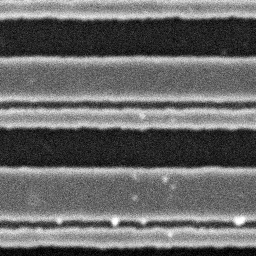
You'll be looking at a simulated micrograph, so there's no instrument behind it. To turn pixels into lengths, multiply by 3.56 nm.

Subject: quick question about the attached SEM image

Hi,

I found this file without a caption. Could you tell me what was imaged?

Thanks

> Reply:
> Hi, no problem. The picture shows lines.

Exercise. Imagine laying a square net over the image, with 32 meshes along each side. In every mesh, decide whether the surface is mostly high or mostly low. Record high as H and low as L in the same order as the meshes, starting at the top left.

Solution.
HHHHHHHHHHHHHHHHHHHHHHHHHHHHHHHH
HHHHHHHHHHHHHHHHHHHHHHHHHHHHHHHH
LLLLLLLLLLLLLLLLLLLLLLLLLLLLLLLL
LLLLLLLLLLLLLLLLLLLLLLLLLLLLLLLL
LLLLLLLLLLLLLLLLLLLLLLLLLLLLLLLL
LLLLLLLLLLLLLLLLLLLLLLLLLLLLLLLL
LLLLLLLLLLLLLLLLLLLLLLLLLLLLLLLL
HHHHHHHHHHHHHHHHHHHHHHHHHHHHHHHH
HHHHHHHHHHHHHHHHHHHHHHHHHHHHHHHH
HHHHHHHHHHHHHHHHHHHHHHHHHHHHHHHH
HHHHHHHHHHHHHHHHHHHHHHHHHHHHHHHH
HHHHHHHHHHHHHHHHHHHHHHHHHHHHHHHH
HHHHHHHHHHHHHHHHHHHHHHHHHHHHHHHH
HHHHHHHHHHHHHHHHHHHHHHHHHHHHHHHH
HHHHHHHHHHHHHHHHHHHHHHHHHHHHHHHH
HHHHHHHHHHHHHHHHHHHHHHHHHHHHHHHH
LLLLLLLLLLLLLLLLLLLLLLLLLLLLLLLL
LLLLLLLLLLLLLLLLLLLLLLLLLLLLLLLL
LLLLLLLLLLLLLLLLLLLLLLLLLLLLLLLL
LLLLLLLLLLLLLLLLLLLLLLLLLLLLLLLL
LLLLLLLLLLLLLLLLLLLLLLLLLLLLLLLL
HHHHHHHHHHHHHHHHHHHHHHHHHHHHHHHH
HHHHHHHHHHHHHHHHHHHHHHHHHHHHHHHH
HHHHHHHHHHHHHHHHHHHHHHHHHHHHHHHH
HHHHHHHHHHHHHHHHHHHHHHHHHHHHHHHH
HHHHHHHHHHHHHHHHHHHHHHHHHHHHHHHH
HHHHHHHHHHHHHHHHHHHHHHHHHHHHHHHH
HHHHHHHHHHHHHHHHHHHHHHHHHHHHHHHH
HHHHHHHHHHHHHHHHHHHHHHHHHHHHHHHH
HHHHHHHHHHHHHHHHHHHHHHHHHHHHHHHH
HHHHHHHHHHHHHHHHHHHHHHHHHHHHHHHH
LLLLLLLLLLLLLLLLLLLLLLLLLLLLLLLL